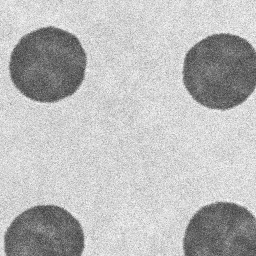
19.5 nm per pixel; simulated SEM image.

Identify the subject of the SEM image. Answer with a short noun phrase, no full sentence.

holes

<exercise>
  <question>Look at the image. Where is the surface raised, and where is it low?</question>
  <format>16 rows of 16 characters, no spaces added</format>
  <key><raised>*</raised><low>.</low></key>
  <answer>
****************
****************
*....********..*
*....*******....
*....******.....
*....*******....
************...*
****************
****************
****************
****************
****************
****************
*....*******....
.....*******....
.....******.....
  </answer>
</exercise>